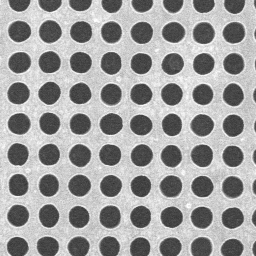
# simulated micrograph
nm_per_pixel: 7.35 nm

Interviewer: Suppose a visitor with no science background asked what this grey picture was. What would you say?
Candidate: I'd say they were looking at a regular array of holes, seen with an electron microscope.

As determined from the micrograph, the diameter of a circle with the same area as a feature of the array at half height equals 0.163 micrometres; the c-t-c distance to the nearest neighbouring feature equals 0.222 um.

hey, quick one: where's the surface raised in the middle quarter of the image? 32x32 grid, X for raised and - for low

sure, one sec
X------XX-----XXX-----XX------XX
XX----XXXX----XXX----XXXX----XXX
XXXXXXXXXXX--XXXXXX-XXXXXX--XXXX
XXXXXXXXXXXXXXXXXXXXXXXXXXXXXXXX
XXXXXXXXXXXXXXXXXXXXXXXXXXXXXXXX
XX----XXXX----XXX----XXXX----XXX
XX-----XX-----XXX-----XX-----XXX
X------XX------X------XX------XX
X------XX-----XXX-----XX-----XXX
XX----XXXX----XXX----XXXX----XXX
XXXXXXXXXXXXXXXXXXXXXXXXXXXXXXXX
XXXXXXXXXXXXXXXXXXXXXXXXXXXXXXXX
XXX--XXXXXX--XXXXXXXXXXXXX-XXXXX
XX----XXXX----XXX----XXXX----XXX
X------XX------XX-----XX-----XXX
X------XX------X------XX------X-
XX----XXX-----XXX-----XXX----XXX
XXX--XXXXX---XXXXX---XXXX----XXX
XXXXXXXXXXXXXXXXXXXXXXXXXXXXXXXX
XXXXXXXXXXXXXXXXXXXXXXXXXXXXXXXX
XX---XXXXX---XXXXX---XXXXX--XXXX
XX----XXX-----XXX-----XXX----XXX
X------XX-----XXX-----XX-----XXX
X------XX-----XXX-----XX------XX
XX----XXX-----XXX-----XXX----XXX
XXX--XXXXXXXXXXXXX--XXXXXX--XXXX
XXXXXXXXXXXXXXXXXXXXXXXXXXXXXXXX
XXXXXXXXXXXXXXXXXXXXXXXXXXXXXXXX
XX----XXXX----XXXX---XXXX----XXX
X------XX-----XXX-----XX-----XXX
X------XX------X------XX------XX
X-----XXX-----XXX-----XX-----XXX